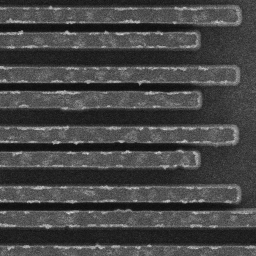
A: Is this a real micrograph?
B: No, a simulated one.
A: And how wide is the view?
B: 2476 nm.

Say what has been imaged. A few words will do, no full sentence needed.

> parallel lines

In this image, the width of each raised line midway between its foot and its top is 176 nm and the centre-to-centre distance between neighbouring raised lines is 281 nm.